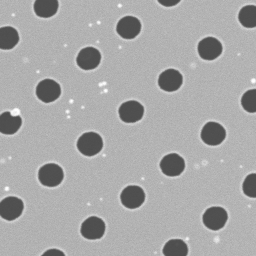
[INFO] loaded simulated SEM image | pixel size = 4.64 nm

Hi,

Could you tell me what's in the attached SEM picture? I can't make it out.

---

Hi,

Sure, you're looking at a regular array of holes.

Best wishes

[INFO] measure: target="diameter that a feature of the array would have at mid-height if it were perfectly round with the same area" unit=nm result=114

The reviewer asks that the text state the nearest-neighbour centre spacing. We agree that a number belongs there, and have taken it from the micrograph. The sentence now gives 0.235 µm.